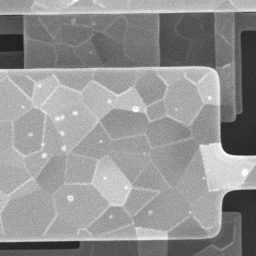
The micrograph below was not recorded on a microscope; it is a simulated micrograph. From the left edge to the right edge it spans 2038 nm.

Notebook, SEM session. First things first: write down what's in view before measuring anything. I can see wiring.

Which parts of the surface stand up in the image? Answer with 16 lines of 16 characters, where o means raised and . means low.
oooooooooooooooo
..oooooooo...oo.
..oooooooo...oo.
..oooooooo....o.
ooooooooooooooo.
ooooooooooooooo.
ooooooooooooooo.
oooooooooooooo..
oooooooooooooo..
oooooooooooooo..
oooooooooooooooo
oooooooooooooooo
oooooooooooooo..
oooooooooooooo..
oooooooooooooo..
................